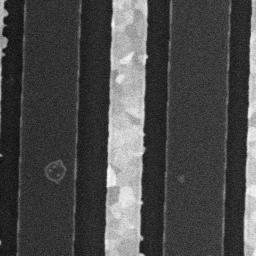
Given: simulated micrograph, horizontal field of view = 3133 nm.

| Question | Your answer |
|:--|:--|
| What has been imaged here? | lines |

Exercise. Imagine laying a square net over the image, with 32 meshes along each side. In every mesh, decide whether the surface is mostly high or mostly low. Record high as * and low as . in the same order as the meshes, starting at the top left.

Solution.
...*******....****...********...
...*******....****...********...
...*******....****...********...
...*******....****...********...
...*******....****...********..*
...*******....****...********..*
...*******....****...********..*
...*******....****...********..*
...*******....****...********..*
...*******....****...*******...*
...*******....****...*******...*
...*******....****...*******...*
...*******....****...*******...*
...*******....****...*******...*
...*******....****...*******...*
...*******....****...*******...*
...*******....****...*******...*
...*******....****...*******...*
...******.....****...*******...*
..*******.....****...*******...*
..*******.....****...*******...*
..*******.....****...*******...*
..*******.....****...*******...*
..*******....****....*******...*
..*******....****....*******...*
..*******....****....*******...*
..*******....****....*******...*
..*******....****....*******...*
..*******....****....*******...*
..*******....****...********...*
..*******....****...********...*
..*******....****...********...*